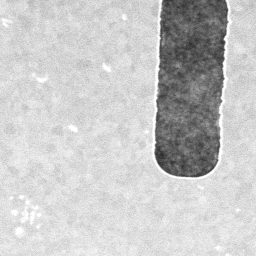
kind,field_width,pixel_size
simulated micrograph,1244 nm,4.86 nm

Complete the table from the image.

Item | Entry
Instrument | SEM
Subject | one or a few lines or trenches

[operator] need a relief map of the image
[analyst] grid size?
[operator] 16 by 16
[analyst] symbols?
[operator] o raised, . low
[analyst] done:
oooooooooo....oo
oooooooooo....oo
oooooooooo....oo
oooooooooo....oo
oooooooooo....oo
oooooooooo....oo
oooooooooo....oo
oooooooooo....oo
oooooooooo....oo
oooooooooo....oo
oooooooooo...ooo
oooooooooooooooo
oooooooooooooooo
oooooooooooooooo
oooooooooooooooo
oooooooooooooooo